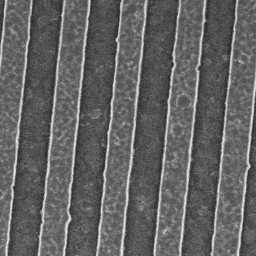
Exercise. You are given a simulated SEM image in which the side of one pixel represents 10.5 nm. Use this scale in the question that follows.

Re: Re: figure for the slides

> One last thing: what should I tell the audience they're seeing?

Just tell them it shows parallel lines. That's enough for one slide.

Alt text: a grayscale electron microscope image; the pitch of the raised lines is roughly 57.6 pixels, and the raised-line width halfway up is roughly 0.264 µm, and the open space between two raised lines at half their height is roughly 0.336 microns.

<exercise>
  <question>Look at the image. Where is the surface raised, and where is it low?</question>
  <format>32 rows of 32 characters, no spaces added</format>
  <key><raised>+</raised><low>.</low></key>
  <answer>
.+++....+++....+++....++++....++
.+++....+++....+++....++++....++
.+++....+++....+++....+++....+++
++++....+++....+++....+++....+++
++++....+++....+++....+++....+++
+++.....+++....+++....+++....+++
+++....+++.....+++....+++....+++
+++....+++.....+++....+++....+++
+++....+++....+++.....+++....+++
+++....+++....+++....++++....+++
+++....+++....+++....++++....+++
+++....+++....+++....++++...++++
+++....+++....+++....+++....++++
+++....+++....+++....+++....++++
++.....+++....+++....+++....++++
++....++++....+++....+++....+++.
++....++++....+++....+++....+++.
++....+++.....+++....+++....+++.
++....+++....+++.....+++....+++.
++....+++....+++.....+++....+++.
++....+++....+++....++++....+++.
++....+++....+++....++++....+++.
++....+++....+++....+++....++++.
++....+++....+++....+++....++++.
++....+++....+++....+++....++++.
+.....+++....+++....+++....+++..
+....++++....+++....+++....+++..
+....++++....+++....+++....+++..
+....+++....++++....+++....+++..
+....+++....+++.....+++....+++..
+....+++....+++....++++....+++..
+....+++....+++....+++.....+++..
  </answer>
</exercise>